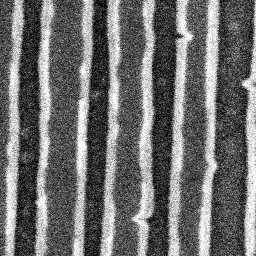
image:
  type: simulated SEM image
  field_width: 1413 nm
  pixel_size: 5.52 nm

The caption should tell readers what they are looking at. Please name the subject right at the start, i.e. one or a few lines or trenches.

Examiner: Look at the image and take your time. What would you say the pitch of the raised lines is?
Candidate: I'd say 360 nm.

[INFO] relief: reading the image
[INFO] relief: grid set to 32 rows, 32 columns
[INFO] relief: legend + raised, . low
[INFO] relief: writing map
++....+++++...+++++....++++.....
++....+++++...+++++....++++.....
++....+++++...+++++....++++.....
++....+++++...+++++....++++.....
++....+++++...+++++....++++.....
++...++++++...+++++....++++.....
++...++++++...+++++....++++.....
++...++++++...+++++....++++.....
++...++++++...+++++...++++......
++...++++++...++++....++++......
++...++++++...+++++...++++.....+
++...++++++...+++++...++++.....+
++....+++++...+++++...++++......
++....+++++...+++++...++++.....+
++...++++++...+++++...++++.....+
++...+++++....+++++...++++.....+
++...+++++....++++....++++.....+
++...+++++....++++....++++.....+
++...++++++...++++....++++.....+
++...+++++....++++....++++.....+
++...+++++....++++....+++++....+
++...+++++....++++....++++.....+
++...+++++....++++....++++.....+
++...+++++....++++....++++.....+
++...+++++....++++....++++.....+
++...+++++....++++....++++.....+
++...+++++....++++....++++.....+
++...+++++....++++....++++.....+
+....+++++...+++++....++++.....+
+....+++++...+++++....++++.....+
+....+++++...+++++....++++.....+
+....+++++...+++++....++++.....+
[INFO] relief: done